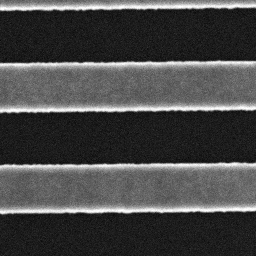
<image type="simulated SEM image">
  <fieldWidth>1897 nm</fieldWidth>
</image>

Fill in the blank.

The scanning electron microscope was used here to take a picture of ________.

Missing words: lines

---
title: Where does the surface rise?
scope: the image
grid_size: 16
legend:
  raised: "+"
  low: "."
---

+++++++++++++...
................
................
................
++++++++++++++++
++++++++++++++++
++++++++++++++++
................
................
................
++++++++++++++++
++++++++++++++++
++++++++++++++++
................
................
................